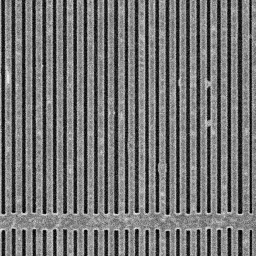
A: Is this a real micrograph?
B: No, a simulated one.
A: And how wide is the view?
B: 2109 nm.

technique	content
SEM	parallel lines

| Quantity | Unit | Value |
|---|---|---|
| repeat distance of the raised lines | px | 10.4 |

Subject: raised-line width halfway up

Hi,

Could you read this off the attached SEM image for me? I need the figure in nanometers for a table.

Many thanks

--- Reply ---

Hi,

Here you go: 50.5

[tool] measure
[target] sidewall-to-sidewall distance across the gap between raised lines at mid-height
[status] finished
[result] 36.1 nm